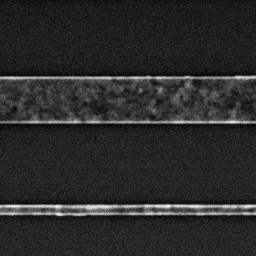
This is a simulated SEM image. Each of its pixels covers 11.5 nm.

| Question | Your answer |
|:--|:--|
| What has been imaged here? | lines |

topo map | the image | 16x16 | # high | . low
................
................
................
................
................
################
################
################
................
................
................
................
................
................
................
................